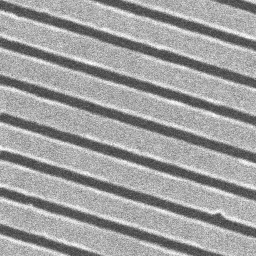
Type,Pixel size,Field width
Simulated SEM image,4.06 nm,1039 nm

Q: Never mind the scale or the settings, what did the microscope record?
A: parallel lines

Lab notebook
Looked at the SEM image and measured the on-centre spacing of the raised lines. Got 145 nm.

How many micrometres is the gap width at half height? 0.0442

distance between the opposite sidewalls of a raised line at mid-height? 100 nanometers